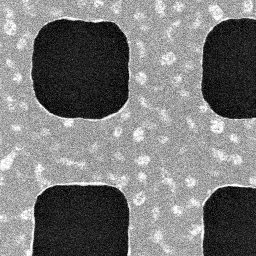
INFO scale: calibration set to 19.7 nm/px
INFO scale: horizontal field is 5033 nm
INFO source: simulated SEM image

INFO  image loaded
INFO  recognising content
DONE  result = holes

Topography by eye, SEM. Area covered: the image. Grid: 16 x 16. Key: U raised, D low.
UUUUUUUUUUUUUUUU
UUUDDDDUUUUUUUDD
UUDDDDDDUUUUUDDD
UUDDDDDDUUUUUDDD
UUDDDDDDUUUUUDDD
UUDDDDDDUUUUUDDD
UUUDDDDDUUUUUDDD
UUUUUUUUUUUUUUUU
UUUUUUUUUUUUUUUU
UUUUUUUUUUUUUUUU
UUUUUUUUUUUUUUUU
UUUUDDUUUUUUUUUU
UUDDDDDDUUUUUDDD
UUDDDDDDUUUUUDDD
UUDDDDDDUUUUUDDD
UUDDDDDDUUUUUDDD